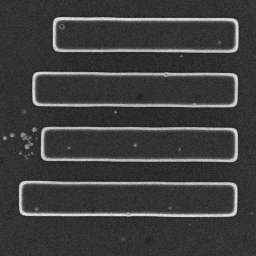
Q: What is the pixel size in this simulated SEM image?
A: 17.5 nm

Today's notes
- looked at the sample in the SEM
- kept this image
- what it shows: groups of lines, slits or small figures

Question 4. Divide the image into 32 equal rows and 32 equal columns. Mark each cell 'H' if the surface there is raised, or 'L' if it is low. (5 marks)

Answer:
LLLLLLLLLLLLLLLLLLLLLLLLLLLLLLLL
LLLLLLLLLLLLLLLLLLLLLLLLLLLLLLLL
LLLLLLLHHHHHHHHHHHHHHHLHHLLLLLLL
LLLLLLLHHHHHHHHHHHHHHHHHHHHHHHLL
LLLLLLLHHHHHHHHHHHHHHHHHHHHHHHLL
LLLLLLLHHHHHHHHHHHHHHHHHHHHHHHLL
LLLLLLLLLLLLLLLLLLLLLLLLLLLLLLLL
LLLLLLLLLLLLLLLLLLLLLLLLLLLLLLLL
LLLLLLLLLLLLLLLLLLLLLLLLLLLLLLLL
LLLLHHHHHHHHHHHHHHHHHHHHHHHHHLLL
LLLLHHHHHHHHHHHHHHHHHHHHHHHHHLLL
LLLLHHHHHHHHHHHHHHHHHHHHHHHHHLLL
LLLLHHHHHHHHHHHHHHHHHHHHHHHHHLLL
LLLLLLLLLLLLLLLLLLLLLLLLLLLLLLLL
LLLLLLLLLLLLLLLLLLLLLLLLLLLLLLLL
LLLLLLLLLLLLLLLLLLLLLLLLLLLLLLLL
LLLLLHHHHHHHHHHHHHHHHHHHHHHHHLLL
LLLLLHHHHHHHHHHHHHHHHHHHHHHHHLLL
LLLLLHHHHHHHHHHHHHHHHHHHHHHHHLLL
LLLLLHHHHHHHHHHHHHHHHHHHHHHHHLLL
LLLLLLLLLLLLLLLLLLLLLLLLLLLLLLLL
LLLLLLLLLLLLLLLLLLLLLLLLLLLLLLLL
LLLLLLLLLLLLLLLLLLLLLLLLLLLLLLLL
LLLHHHHHHHHHHHHHHHHHHHHHHHHHHLLL
LLLHHHHHHHHHHHHHHHHHHHHHHHHHHLLL
LLLHHHHHHHHHHHHHHHHHHHHHHHHHHLLL
LLLHHHHHHHHHHHHHHHHHHHHHHHHHHLLL
LLLLLLLLLLLLLLLLLLLLLLLLLLLLLLLL
LLLLLLLLLLLLLLLLLLLLLLLLLLLLLLLL
LLLLLLLLLLLLLLLLLLLLLLLLLLLLLLLL
LLLLLLLLLLLLLLLLLLLLLLLLLLLLLLLL
LLLLLLLLLLLLLLLLLLLLLLLLLLLLLLLL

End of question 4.